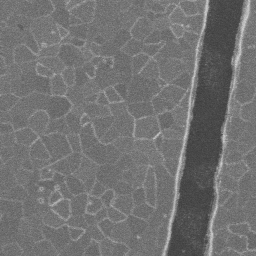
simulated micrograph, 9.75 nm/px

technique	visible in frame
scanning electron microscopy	one or a few lines or trenches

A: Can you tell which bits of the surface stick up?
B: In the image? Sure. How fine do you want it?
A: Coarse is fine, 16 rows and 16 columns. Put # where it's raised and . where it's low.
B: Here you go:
#############...
#############..#
############...#
############...#
############...#
############...#
############..##
############..##
############..##
###########...##
###########...##
###########...##
###########...##
###########..###
###########..###
##########...###